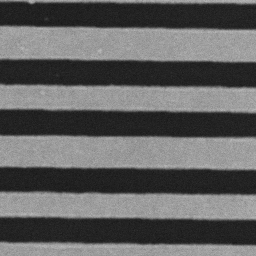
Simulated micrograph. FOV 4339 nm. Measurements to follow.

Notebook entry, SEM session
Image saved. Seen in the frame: lines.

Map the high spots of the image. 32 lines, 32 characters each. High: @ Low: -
--------------------------------
--------------------------------
--------------------------------
@@@@@@@-------------------------
@@@@@@@@@@@@@@@@@@@@@@@@@@@@@@@@
@@@@@@@@@@@@@@@@@@@@@@@@@@@@@@@@
@@@@@@@@@@@@@@@@@@@@@@@@@@@@@@@@
-------------------------@@@@@@@
--------------------------------
--------------------------------
--------------------------------
@@@@@@@@@@@@@@@@@@@@@@@@@@@@@@@@
@@@@@@@@@@@@@@@@@@@@@@@@@@@@@@@@
@@@@@@@@@@@@@@@@@@@@@@@@@@@@@@@@
--------------------------------
--------------------------------
--------------------------------
@@@@@@@@@@@@@@@@@@@@@@@@@@@@@@@@
@@@@@@@@@@@@@@@@@@@@@@@@@@@@@@@@
@@@@@@@@@@@@@@@@@@@@@@@@@@@@@@@@
@@@@@@@@@@@@@@@@@@@@@@@@@@@@@@@@
--------------------------------
--------------------------------
--------------------------------
@@@@@@@@@@@@@@@@@@@@@@@@@@@@@@@-
@@@@@@@@@@@@@@@@@@@@@@@@@@@@@@@@
@@@@@@@@@@@@@@@@@@@@@@@@@@@@@@@@
--------------------------------
--------------------------------
--------------------------------
--------------------------------
@@@@@@@@@@@@@@@@@@@@@@@@@@@@@@@@